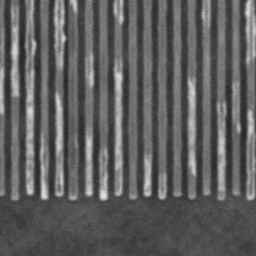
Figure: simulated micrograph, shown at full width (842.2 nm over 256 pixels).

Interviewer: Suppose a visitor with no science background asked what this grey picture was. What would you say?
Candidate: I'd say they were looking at parallel lines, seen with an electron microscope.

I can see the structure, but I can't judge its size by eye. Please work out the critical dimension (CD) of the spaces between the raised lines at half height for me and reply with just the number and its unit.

25 nm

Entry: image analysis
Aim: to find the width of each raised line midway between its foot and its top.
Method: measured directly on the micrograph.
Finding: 21.8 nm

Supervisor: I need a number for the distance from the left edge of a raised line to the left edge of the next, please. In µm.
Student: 0.0484